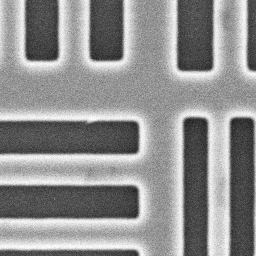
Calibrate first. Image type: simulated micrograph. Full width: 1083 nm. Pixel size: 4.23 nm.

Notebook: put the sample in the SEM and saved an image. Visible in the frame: groups of lines, slits or small figures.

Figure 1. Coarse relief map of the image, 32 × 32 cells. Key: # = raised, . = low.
###....####.....######.....####.
###.....###.....######.....####.
###.....###.....######.....####.
###.....###.....######.....####.
###.....###.....######.....####.
###.....###.....######.....####.
###.....###.....######.....####.
###....####....#######.....####.
######################.....####.
################################
################################
################################
################################
################################
################################
.................######...###...
..................#####...###...
..................#####...###...
.................######...###...
#######################...###...
#######################...###...
#######################...###...
#######################...###...
.................######...###...
..................#####...###...
..................#####...###...
..................#####...###...
#######################...###...
#######################...###...
#######################...###...
#######################...###...
.................######...###...